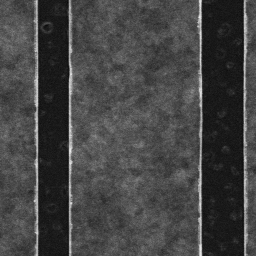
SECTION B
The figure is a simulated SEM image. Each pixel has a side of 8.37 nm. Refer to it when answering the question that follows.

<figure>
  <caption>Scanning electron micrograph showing one or a few lines or trenches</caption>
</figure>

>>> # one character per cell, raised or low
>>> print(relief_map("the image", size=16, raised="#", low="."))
##..#########..#
##..#########..#
##..#########..#
##..#########..#
##..#########..#
##..#########..#
##..#########..#
##..#########..#
##..#########..#
##..#########..#
##..#########..#
##..########...#
##..#########..#
##..#########..#
##..#########..#
##..#########..#